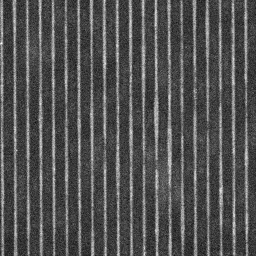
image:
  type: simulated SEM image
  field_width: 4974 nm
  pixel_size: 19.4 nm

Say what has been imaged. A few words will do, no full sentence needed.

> parallel lines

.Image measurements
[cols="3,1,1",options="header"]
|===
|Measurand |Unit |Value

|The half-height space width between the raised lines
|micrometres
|0.202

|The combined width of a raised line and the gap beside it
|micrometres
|0.249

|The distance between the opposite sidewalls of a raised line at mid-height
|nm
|36.4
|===